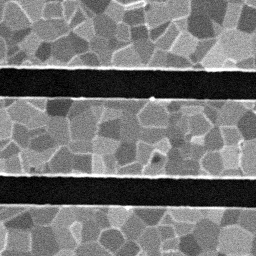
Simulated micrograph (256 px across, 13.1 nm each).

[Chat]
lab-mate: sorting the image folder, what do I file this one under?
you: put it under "lines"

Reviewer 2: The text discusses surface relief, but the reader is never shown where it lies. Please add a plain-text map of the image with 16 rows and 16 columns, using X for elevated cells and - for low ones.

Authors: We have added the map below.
XXXXXXXXXXXXXXXX
XXXXXXXXXXXXXXXX
XXXXXXXXXXXXXXXX
XXXXXXXXXXXXXXXX
----------------
----------------
XXXXXXXXXXXXXXXX
XXXXXXXXXXXXXXXX
XXXXXXXXXXXXXXXX
XXXXXXXXXXXXXXXX
XXXXXXXXXXXXXXXX
----------------
----------------
XXXXXXXXXXXXXXXX
XXXXXXXXXXXXXXXX
XXXXXXXXXXXXXXXX